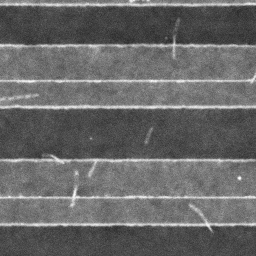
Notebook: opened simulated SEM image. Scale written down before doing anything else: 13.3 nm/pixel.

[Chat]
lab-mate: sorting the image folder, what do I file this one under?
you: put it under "lines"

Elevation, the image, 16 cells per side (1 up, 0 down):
0000000000000000
0000000000000000
0000000000000000
1111111111111111
1111111111111111
1111111111111111
1111111111111111
0000000000000000
0000000000000000
0000000000000000
1111111111111111
1111111111111111
1111111111111111
1111111111111111
0000000000000000
0000000000000000